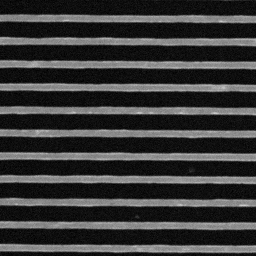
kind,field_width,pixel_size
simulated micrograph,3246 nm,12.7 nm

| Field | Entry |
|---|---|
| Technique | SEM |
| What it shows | parallel lines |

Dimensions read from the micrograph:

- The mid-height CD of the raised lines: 76.1 nm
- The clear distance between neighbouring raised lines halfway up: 0.208 µm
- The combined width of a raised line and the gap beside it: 0.291 micrometres